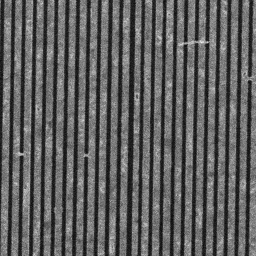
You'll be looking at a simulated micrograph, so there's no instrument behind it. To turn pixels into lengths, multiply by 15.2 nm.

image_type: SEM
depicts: parallel lines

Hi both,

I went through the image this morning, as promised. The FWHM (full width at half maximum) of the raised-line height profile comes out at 95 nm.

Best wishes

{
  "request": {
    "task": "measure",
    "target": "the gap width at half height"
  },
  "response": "68.4 nm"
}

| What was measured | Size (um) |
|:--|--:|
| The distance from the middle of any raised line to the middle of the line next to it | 0.164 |